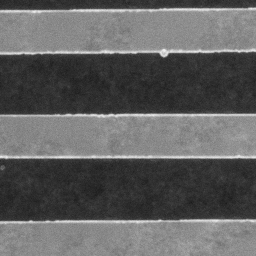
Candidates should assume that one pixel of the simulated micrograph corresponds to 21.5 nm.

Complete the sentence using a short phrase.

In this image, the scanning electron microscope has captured lines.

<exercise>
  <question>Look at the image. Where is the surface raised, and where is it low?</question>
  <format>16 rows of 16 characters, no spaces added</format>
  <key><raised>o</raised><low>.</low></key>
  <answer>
................
oooooooooooooooo
oooooooooooooooo
................
................
................
................
oooooooooooooooo
oooooooooooooooo
oooooooooooooooo
................
................
................
................
oooooooooooooooo
oooooooooooooooo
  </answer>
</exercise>